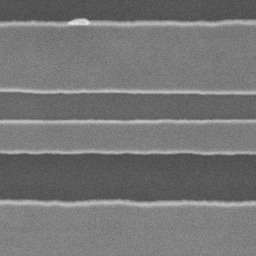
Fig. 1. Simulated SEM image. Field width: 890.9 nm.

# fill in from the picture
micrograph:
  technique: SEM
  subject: lines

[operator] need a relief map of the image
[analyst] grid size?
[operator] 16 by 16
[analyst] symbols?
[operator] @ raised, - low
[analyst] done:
----------------
@@@@@@@@@@@@@@@@
@@@@@@@@@@@@@@@@
@@@@@@@@@@@@@@@@
@@@@@@@@@@@@@@@@
@@@@@@@@@@@@@@@@
@@@@@@@@@@@@@@@@
@@@@@@@@@@@@@@@@
@@@@@@@@@@@@@@@@
@@@@@@@@@@@@@@@@
----------------
----------------
----------------
@@@@@@@@@@@@@@@@
@@@@@@@@@@@@@@@@
@@@@@@@@@@@@@@@@